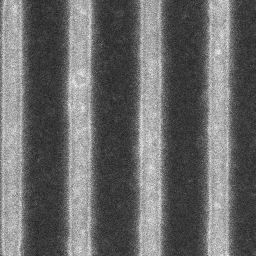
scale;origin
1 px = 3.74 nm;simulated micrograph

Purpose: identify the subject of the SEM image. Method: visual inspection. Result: one or a few lines or trenches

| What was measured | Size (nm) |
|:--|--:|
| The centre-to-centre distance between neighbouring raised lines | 261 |